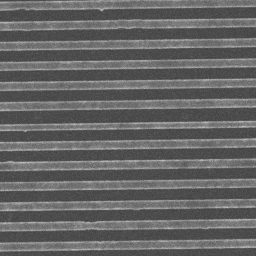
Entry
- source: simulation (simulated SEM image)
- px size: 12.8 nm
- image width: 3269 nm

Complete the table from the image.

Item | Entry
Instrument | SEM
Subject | parallel lines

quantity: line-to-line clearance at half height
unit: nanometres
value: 154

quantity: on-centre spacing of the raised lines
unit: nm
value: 256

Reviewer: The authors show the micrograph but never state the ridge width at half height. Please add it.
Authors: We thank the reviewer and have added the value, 0.101 um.